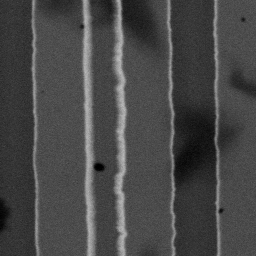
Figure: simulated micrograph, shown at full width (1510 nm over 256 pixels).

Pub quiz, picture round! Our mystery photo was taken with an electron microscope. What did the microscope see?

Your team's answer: lines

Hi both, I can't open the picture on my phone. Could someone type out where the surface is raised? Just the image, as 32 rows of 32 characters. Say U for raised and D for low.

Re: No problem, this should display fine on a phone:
DDDDUUUUUUUDDDUUUUUUUDDDDDDUUUUU
DDDDUUUUUUUDDDUUUUUUUDDDDDDUUUUU
DDDDUUUUUUUDDDUUUUUUUDDDDDDUUUUU
DDDDUUUUUUUDDDUUUUUUUDDDDDDUUUUU
DDDDUUUUUUUDDDDUUUUUUDDDDDDUUUUU
DDDDUUUUUUUDDDDUUUUUUDDDDDDUUUUU
DDDDUUUUUUUDDDUUUUUUUDDDDDDUUUUU
DDDDUUUUUUUDDDUUUUUUUDDDDDDUUUUU
DDDDUUUUUUUDDDUUUUUUUDDDDDDUUUUU
DDDDUUUUUUUDDDDUUUUUUDDDDDDUUUUU
DDDDUUUUUUUDDDDUUUUUUDDDDDDUUUUU
DDDDUUUUUUUDDDDUUUUUUDDDDDDUUUUU
DDDDUUUUUUUDDDDUUUUUUDDDDDDUUUUU
DDDDUUUUUUUDDDDUUUUUUUDDDDDUUUUU
DDDDUUUUUUUDDDDUUUUUUUDDDDDUUUUU
DDDDUUUUUUUDDDDUUUUUUUDDDDDUUUUU
DDDDUUUUUUUDDDDUUUUUUUDDDDDUUUUU
DDDDUUUUUUUDDDDUUUUUUUDDDDDUUUUU
DDDDUUUUUUUDDDDUUUUUUDDDDDDUUUUU
DDDDUUUUUUUDDDDUUUUUUUDDDDDUUUUU
DDDDUUUUUUUDDDDUUUUUUUDDDDDUUUUU
DDDDUUUUUUUDDDDUUUUUUUDDDDDUUUUU
DDDDUUUUUUUDDDDUUUUUUUDDDDDUUUUU
DDDDDUUUUUUDDDDUUUUUUUDDDDDUUUUU
DDDDDUUUUUUDDDDUUUUUUUDDDDDUUUUU
DDDDUUUUUUUUDDDUUUUUUUDDDDDUUUUU
DDDDUUUUUUUUDDDUUUUUUUDDDDDUUUUU
DDDDUUUUUUUUDDDUUUUUUUDDDDDUUUUU
DDDDUUUUUUUUDDDUUUUUUUDDDDDUUUUU
DDDDUUUUUUUUDDDUUUUUUUDDDDDUUUUU
DDDDDUUUUUUUDDDUUUUUUUDDDDDUUUUU
DDDDDUUUUUUUDDDUUUUUUUDDDDDUUUUU